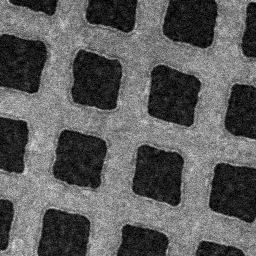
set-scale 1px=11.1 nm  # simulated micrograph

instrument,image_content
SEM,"raised bodies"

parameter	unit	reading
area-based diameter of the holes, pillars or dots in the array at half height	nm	647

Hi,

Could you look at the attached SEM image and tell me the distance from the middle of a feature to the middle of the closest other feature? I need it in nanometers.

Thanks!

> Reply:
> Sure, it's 882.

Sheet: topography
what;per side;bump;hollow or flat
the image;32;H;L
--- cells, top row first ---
LHHHHHHLLLLHHHHHHLLLLHHHHHHLLLLH
LLLLHHHLLLLHHHHHHLLLLHHHHHHLLLLH
LLLLLLLLLLLHHHHHHLLLHHHHHHHLLLLH
LLLLLLLLLLLLLLHHHLLLHHHHHHHLLLLH
HHLLLLLLLLHLLLLLLLLLLHHHHHHLLLHH
HHHHHHLLLLLLLLLLLLLLLLLHHHHLLLHH
HHHHHHLLLLHHLLLLLLLLLLLLLLLLLLHH
HHHHHHLLLHHHHHHLLLLLLLLLLLLLLLLL
HHHHHHLLLHHHHHHLLLLHHHLLLLLLLLLL
HHHHHLLLLHHHHHHLLLLHHHHHLLLLLLLL
HHHHHLLLLHHHHHHLLLLHHHHHHLLLLHHL
LLLHHLLLLHHHHHHLLLLHHHHHHLLLLHHH
LLLLLLLLLHHHHHHLLLHHHHHHHLLLHHHH
LLLLLLLLLLLLHHLLLLHHHHHHHLLLHHHH
LLLLLLLLLLLLLLLLLLLHHHHHLLLLHHHH
HHHHLLLLLLLLLLLLLLLLLLHHLLLLHHHH
HHHHLLLLHHLLLLLLLLLLLLLLLLLLLHHH
HHHHLLLHHHHHHLLLLLLLLLLLLLLLLLLH
HHHLLLLHHHHHHLLLLHHHLLLLLLLLLLLL
HHHLLLLHHHHHHLLLLHHHHHHLLLLLLLLL
HHHLLLLHHHHHHLLLLHHHHHHLLLLHHLLL
LHHLLLLHHHHHHLLLLHHHHHHLLLLHHHHH
LLLLLLLHHHHHHLLLHHHHHHHLLLHHHHHH
LLLLLLLLLLHHLLLLHHHHHHHLLLHHHHHH
LLLLLLLLLLLLLLLLLHHHHHHLLLHHHHHH
HHLLLLLLLLLLLLLLLLLLLHHLLLHHHHHH
HHLLLLHHHLLLLLLLLLLLLLLLLLLHHHHH
HHLLLHHHHHHLLLLLLLLLLLLLLLLLLLHH
HLLLLHHHHHHLLLLHHHHLLLLLLLLLLLLL
HLLLLHHHHHHLLLLHHHHHHLLLLLLLLLLL
HHHLLHHHHHHLLLLHHHHHHLLLLHHHLLLL
LLLLLHHHHHHLLLLHHHHHHLLLHHHHHHHL